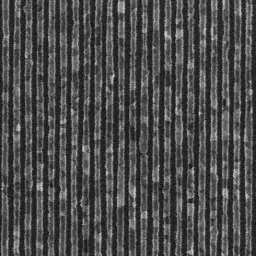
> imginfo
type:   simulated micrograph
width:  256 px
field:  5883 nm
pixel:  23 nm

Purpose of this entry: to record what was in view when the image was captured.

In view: parallel lines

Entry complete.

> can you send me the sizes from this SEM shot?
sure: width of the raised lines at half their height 5.25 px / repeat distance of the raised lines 266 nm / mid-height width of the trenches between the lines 161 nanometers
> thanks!